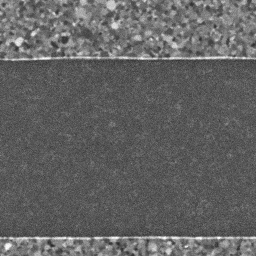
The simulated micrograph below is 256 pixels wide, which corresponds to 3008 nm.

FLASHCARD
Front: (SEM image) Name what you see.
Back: one or a few lines or trenches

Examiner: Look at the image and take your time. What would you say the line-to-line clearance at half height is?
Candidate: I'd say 2120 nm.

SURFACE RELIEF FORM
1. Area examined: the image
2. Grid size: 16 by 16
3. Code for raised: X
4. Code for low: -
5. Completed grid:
XXXXXXXXXXXXXXXX
XXXXXXXXXXXXXXXX
XXXXXXXXXXXXXXXX
XXXXXXXXXXXXXXXX
----------------
----------------
----------------
----------------
----------------
----------------
----------------
----------------
----------------
----------------
----------------
XXXXXXXXXXXXXXXX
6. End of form